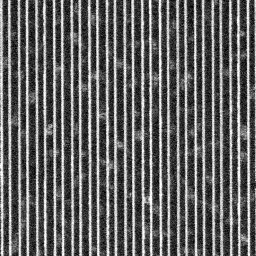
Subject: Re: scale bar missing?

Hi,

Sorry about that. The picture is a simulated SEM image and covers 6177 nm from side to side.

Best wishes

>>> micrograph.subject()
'parallel lines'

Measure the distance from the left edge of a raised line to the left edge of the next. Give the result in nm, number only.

212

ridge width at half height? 36.2 nanometres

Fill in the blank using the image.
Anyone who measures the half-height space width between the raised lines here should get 163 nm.